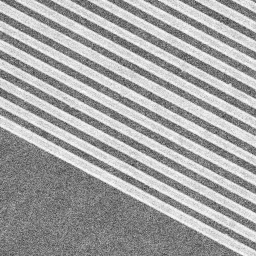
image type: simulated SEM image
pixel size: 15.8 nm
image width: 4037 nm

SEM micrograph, parallel lines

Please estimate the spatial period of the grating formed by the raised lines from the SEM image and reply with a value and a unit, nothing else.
266 nm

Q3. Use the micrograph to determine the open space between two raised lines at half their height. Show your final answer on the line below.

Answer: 151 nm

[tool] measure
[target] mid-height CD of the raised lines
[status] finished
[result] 110 nanometers